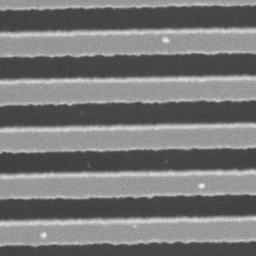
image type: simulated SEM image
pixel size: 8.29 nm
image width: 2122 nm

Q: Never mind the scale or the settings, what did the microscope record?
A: lines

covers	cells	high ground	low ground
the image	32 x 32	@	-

@@@@@@@@@@@@@@@@@@@@@@@@@@@@@@@@
--------------------------------
--------------------------------
--------------------------------
@@@@@@@@@@@@@@@@@@@@@@@@@@@@@@@@
@@@@@@@@@@@@@@@@@@@@@@@@@@@@@@@@
@@@@@@@@@@@@@@@@@@@@@@@@@@@@@@@@
--------------------------------
--------------------------------
------------------------------@-
@@@@@@@@@@@@@@@@@@@@@@@@@@@@@@@@
@@@@@@@@@@@@@@@@@@@@@@@@@@@@@@@@
@@@@@@@@@@@@@@@@@@@@@@@@@@@@@@@@
--------------------------------
--------------------------------
--------------------------@@@@@@
@@@@@@@@@@@@@@@@@@@@@@@@@@@@@@@@
@@@@@@@@@@@@@@@@@@@@@@@@@@@@@@@@
@@@@@@@@@@@@@@@@@@@@@@@@@@@@@@@-
--------------------------------
--------------------------------
--------------@@@@@@@@@@@@@@@@@@
@@@@@@@@@@@@@@@@@@@@@@@@@@@@@@@@
@@@@@@@@@@@@@@@@@@@@@@@@@@@@@@@@
@@@@@@@@@@@@@@@@@@@-------------
--------------------------------
--------------------------------
--------@@-@@@@@@@@@@@@@@@@@@@@@
@@@@@@@@@@@@@@@@@@@@@@@@@@@@@@@@
@@@@@@@@@@@@@@@@@@@@@@@@@@@@@@@@
@@@@@@@@@@@---@-----------------
--------------------------------